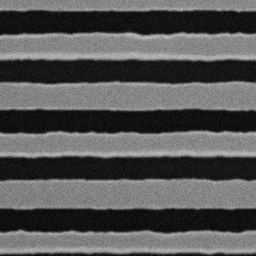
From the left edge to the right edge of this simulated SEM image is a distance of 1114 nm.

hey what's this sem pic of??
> lines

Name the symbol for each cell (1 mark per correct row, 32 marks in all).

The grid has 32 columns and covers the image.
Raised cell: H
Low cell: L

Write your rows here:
HHHHHHHHHHHHHHHHHHHHHHHHHHHHHHHH
LLLLLLLLLLLLLLLLLLLLLLLLLLLLLLLL
LLLLLLLLLLLLLLLLLLLLLLLLLLLLLLLL
LLLLLLLLLLLLLLLLLLLLLLLLLLLLLLLL
HHHHHHHHHHHHHHHHHHHHHHHHHHHHHHHH
HHHHHHHHHHHHHHHHHHHHHHHHHHHHHHHH
HHHHHHHHHHHHHHHHHHHHHHHHHHHHHHHH
LLLLLLLLLLLLLLLLLLLLLLLLLLLLLLLL
LLLLLLLLLLLLLLLLLLLLLLLLLLLLLLLL
LLLLLLLLLLLLLLLLLLLLLLLLLLLLLLLL
HHHHLLLLLLHLHHHHHHHLLLLLHLLHHHHH
HHHHHHHHHHHHHHHHHHHHHHHHHHHHHHHH
HHHHHHHHHHHHHHHHHHHHHHHHHHHHHHHH
HHHHHHHHHHHHHHHHHHHHHHHHHHHHHHHH
LLLLLLLLLLLLLLLLLLLLLLLLLLLLLLLL
LLLLLLLLLLLLLLLLLLLLLLLLLLLLLLLL
LLLLLLLLLLLLLLLLLLLLLLLHHHLLHLLL
HHHHHHHHHHHHHHHHHHHHHHHHHHHHHHHH
HHHHHHHHHHHHHHHHHHHHHHHHHHHHHHHH
LHHHHLHLLLLLHHHLLLLLLLLLLLLLLLLL
LLLLLLLLLLLLLLLLLLLLLLLLLLLLLLLL
LLLLLLLLLLLLLLLLLLLLLLLLLLLLLLLL
LLLLLLHHHHHLLLLHLLHHHHHHHHLLLHLL
HHHHHHHHHHHHHHHHHHHHHHHHHHHHHHHH
HHHHHHHHHHHHHHHHHHHHHHHHHHHHHHHH
HHHHHHHHHHHHHHHHHHHHHHHHHHHHHHHH
LLLLLLLLLLLLLLLLLLLLLLLLLLLLLLLL
LLLLLLLLLLLLLLLLLLLLLLLLLLLLLLLL
LLLLLLLLLLLLLLLLLLLLLLLLLLLLLLLL
HHHHHHHHHHHHHHHHHHHHHHHHHHHHHHHH
HHHHHHHHHHHHHHHHHHHHHHHHHHHHHHHH
HHHHHHHLLHHHLLHHHLHHHHHHLHHHHHHH